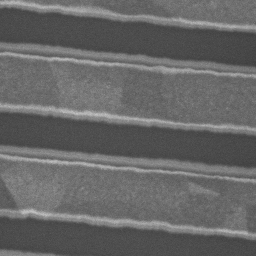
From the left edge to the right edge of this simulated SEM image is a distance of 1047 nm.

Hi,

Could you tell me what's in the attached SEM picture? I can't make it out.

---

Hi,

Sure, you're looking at lines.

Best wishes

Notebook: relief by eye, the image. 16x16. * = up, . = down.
..**************
............****
................
***.............
**************..
****************
****************
........********
................
................
*********.......
****************
****************
...*************
..............**
................